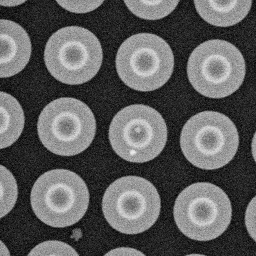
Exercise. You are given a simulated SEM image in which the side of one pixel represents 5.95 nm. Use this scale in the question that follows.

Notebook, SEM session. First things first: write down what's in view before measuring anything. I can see an array of small figures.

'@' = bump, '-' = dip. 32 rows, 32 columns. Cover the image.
@@@----@@@@@@---@@@@@@--@@@@@@@-
---------@@-----@@@@@----@@@@@@-
@-------------------------@@@@--
@@@-----@@----------------------
@@@@--@@@@@@----@@@@------------
@@@@--@@@@@@---@@@@@@----@@@@---
@@@@--@@@@@@@--@@@@@@@--@@@@@@--
@@@@--@@@@@@@-@@@@@@@@--@@@@@@--
@@@---@@@@@@---@@@@@@@-@@@@@@@@-
@------@@@@@---@@@@@@--@@@@@@@@-
--------@@------@@@@@---@@@@@@--
-------------------------@@@@---
@@-----@@@----------------------
@@@---@@@@@-----@@@-------------
@@@--@@@@@@@--@@@@@@----@@@@----
@@@--@@@@@@@--@@@@@@@--@@@@@@---
@@@--@@@@@@@--@@@@@@@--@@@@@@@--
@@---@@@@@@@--@@@@@@@--@@@@@@@--
------@@@@@---@@@@@@---@@@@@@@-@
---------------@@@@@---@@@@@@---
------------------------@@@@----
@-----@@@-----------------------
@@---@@@@@-----@@@--------------
@@--@@@@@@@--@@@@@@----@@@@-----
@@--@@@@@@@--@@@@@@@--@@@@@@----
@@--@@@@@@@--@@@@@@@--@@@@@@@--@
@---@@@@@@@--@@@@@@@--@@@@@@@--@
-----@@@@@---@@@@@@@--@@@@@@@--@
--------------@@@@@---@@@@@@---@
-----------------------@@@@----@
@----@@@------------------------
@---@@@@@@----@@@@--------------